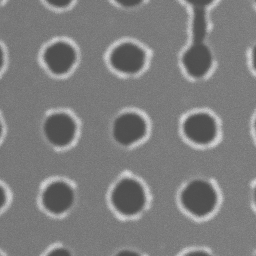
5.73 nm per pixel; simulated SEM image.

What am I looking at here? a regular array of holes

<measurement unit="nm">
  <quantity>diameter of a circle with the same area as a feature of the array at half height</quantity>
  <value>182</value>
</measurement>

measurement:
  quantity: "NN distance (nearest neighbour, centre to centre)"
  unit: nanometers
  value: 392